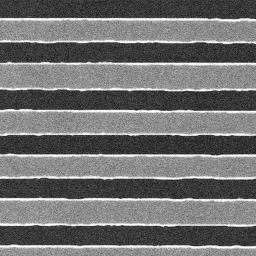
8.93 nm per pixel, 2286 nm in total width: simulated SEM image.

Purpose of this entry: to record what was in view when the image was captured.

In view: lines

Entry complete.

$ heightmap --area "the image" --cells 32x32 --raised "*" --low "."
................................
................................
********************************
********************************
********************************
................................
................................
................................
********************************
********************************
********************************
................................
................................
................................
********************************
********************************
********************************
................................
................................
********************************
********************************
********************************
................................
................................
................................
********************************
********************************
********************************
................................
................................
................................
********************************